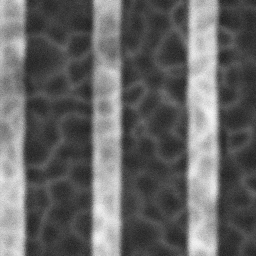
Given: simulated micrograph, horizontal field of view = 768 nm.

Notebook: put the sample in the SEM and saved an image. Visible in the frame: one or a few lines or trenches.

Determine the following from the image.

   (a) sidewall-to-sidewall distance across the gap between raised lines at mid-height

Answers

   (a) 212 nm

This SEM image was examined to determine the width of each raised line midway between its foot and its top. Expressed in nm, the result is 76.1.